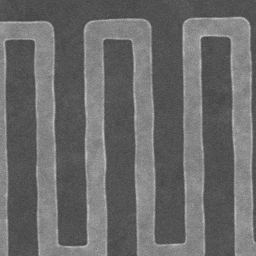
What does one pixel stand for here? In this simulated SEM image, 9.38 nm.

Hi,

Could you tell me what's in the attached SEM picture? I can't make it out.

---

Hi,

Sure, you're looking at groups of lines, slits or small figures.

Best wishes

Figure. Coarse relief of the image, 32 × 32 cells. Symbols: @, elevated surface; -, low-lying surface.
--------------------------------
--------------------------------
--------------@@@@-----@@@@@@@@-
@@@@@@@----@@@@@@@@----@@@@@@@@-
@@@@@@@----@@@@@@@@----@@@--@@@-
@---@@@----@@----@@----@@----@@-
@---@@@----@@----@@----@@----@@-
@---@@@----@@----@@----@@----@@-
@---@@@----@@----@@----@@----@@-
@---@@@----@@----@@----@@----@@-
@----@@----@@----@@----@@----@@-
@----@@----@@----@@----@@----@@-
@----@@----@@----@@----@@----@@-
@----@@----@@----@@----@@----@@-
@----@@----@@----@@----@@----@@-
@----@@----@@----@@----@@----@@-
@----@@----@@----@@----@@----@@-
@----@@----@@----@@----@@----@@-
@----@@----@@----@@----@@----@@-
@----@@----@@----@@----@@----@@-
@----@@----@@----@@----@@----@@-
@----@@----@@----@@----@@----@@-
@----@@----@@----@@----@@----@@-
@----@@----@@----@@----@@----@@-
@----@@----@@----@@----@@----@@@
@----@@----@@----@@----@@----@@@
@----@@----@@----@@----@@----@@@
@----@@----@@----@@----@@----@@-
@----@@----@@----@@----@@----@@@
@----@@----@@----@@----@@@---@@@
@----@@----@@----@@@--@@@@---@@@
@----@@@@@@@@----@@@@@@@@@---@@@